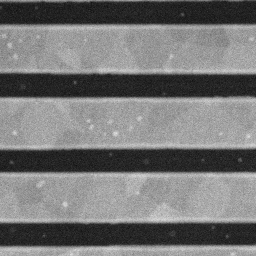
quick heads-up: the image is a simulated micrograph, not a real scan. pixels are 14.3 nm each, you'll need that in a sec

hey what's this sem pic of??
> lines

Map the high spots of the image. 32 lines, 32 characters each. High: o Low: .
................................
................................
................................
oooooooooooooooooooooooooooooooo
oooooooooooooooooooooooooooooooo
oooooooooooooooooooooooooooooooo
oooooooooooooooooooooooooooooooo
oooooooooooooooooooooooooooooooo
oooooooooooooooooooooooooooooooo
................................
................................
................................
oooooooooooooooooooooooooooooooo
oooooooooooooooooooooooooooooooo
oooooooooooooooooooooooooooooooo
oooooooooooooooooooooooooooooooo
oooooooooooooooooooooooooooooooo
oooooooooooooooooooooooooooooooo
oooooo..........................
................................
................................
................................
oooooooooooooooooooooooooooooooo
oooooooooooooooooooooooooooooooo
oooooooooooooooooooooooooooooooo
oooooooooooooooooooooooooooooooo
oooooooooooooooooooooooooooooooo
oooooooooooooooooooooooooooooooo
................................
................................
................................
oooooooooooooooooooooooooooooooo